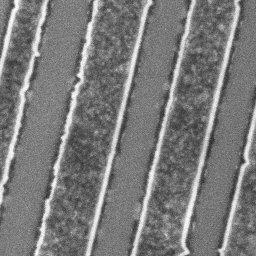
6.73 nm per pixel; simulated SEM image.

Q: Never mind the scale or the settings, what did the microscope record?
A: one or a few lines or trenches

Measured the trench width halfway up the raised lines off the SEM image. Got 0.295 microns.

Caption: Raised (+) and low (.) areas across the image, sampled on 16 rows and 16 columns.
.++...+++...+++.
.++...+++...+++.
++...++++..+++..
++...+++...+++..
++...+++...+++..
++...+++...+++..
+....+++...++...
+...++++..+++...
+...+++...+++...
+...+++...+++..+
....+++...+++..+
...++++..+++...+
...+++...+++...+
...+++...+++..++
...+++...+++..++
..++++..++++..++